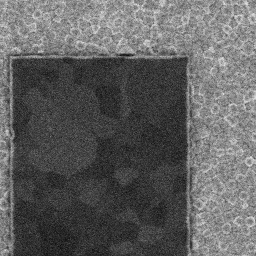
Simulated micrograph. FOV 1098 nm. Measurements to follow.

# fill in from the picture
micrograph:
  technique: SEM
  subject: one or a few lines or trenches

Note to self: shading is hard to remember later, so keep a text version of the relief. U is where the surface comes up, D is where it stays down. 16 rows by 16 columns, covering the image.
DDDDDDDDDDDDDDDD
DDDDDDDDDDDDDDDD
DDDDDDDDDDDDDDDD
DDUUUDUUUDDDDDDD
DUUUUUUUUUUUDDDD
DUUUUUUUUUUUDDDD
DUUUUUUUUUUUDDDD
DUUUUUUUUUUUDDDD
DUUUUUUUUUUUDDDD
DUUUUUUUUUUUDDDD
DUUUUUUUUUUUDDDD
DUUUUUUUUUUUDDDD
UUUUUUUUUUUUDDDD
DUUUUUUUUUUUDDDD
DUUUUUUUUUUUDDDD
DUUUUUUUUUUUDDDD